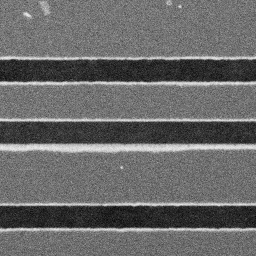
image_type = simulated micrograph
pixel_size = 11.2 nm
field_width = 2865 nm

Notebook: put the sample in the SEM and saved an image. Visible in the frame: lines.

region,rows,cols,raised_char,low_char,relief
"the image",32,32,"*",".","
********************************
********************************
********************************
********************************
********************************
********************************
********************************
................................
................................
................................
********************************
********************************
********************************
********************************
********************************
................................
................................
................................
********************************
********************************
********************************
********************************
********************************
********************************
********************************
********************************
................................
................................
................................
********************************
********************************
********************************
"